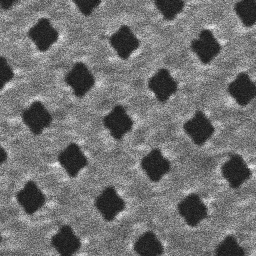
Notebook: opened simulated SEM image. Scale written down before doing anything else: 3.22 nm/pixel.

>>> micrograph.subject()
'a regular array of holes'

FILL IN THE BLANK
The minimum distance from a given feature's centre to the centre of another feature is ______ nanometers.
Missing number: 183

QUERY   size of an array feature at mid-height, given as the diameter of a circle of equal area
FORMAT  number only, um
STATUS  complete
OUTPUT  0.0899